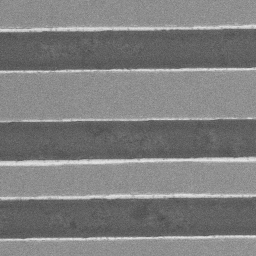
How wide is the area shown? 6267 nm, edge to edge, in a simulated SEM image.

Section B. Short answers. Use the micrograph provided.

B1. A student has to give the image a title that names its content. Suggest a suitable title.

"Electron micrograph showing lines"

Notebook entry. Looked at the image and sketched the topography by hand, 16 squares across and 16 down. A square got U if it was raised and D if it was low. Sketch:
UUUUUUUUUUUUUUUU
UUUUUUUUUUUUUUUU
DDDDDDDDDDDDDDDD
DDDDDDDDDDDDDDDD
UUUUUUUUUUUUUUUU
UUUUUUUUUUUUUUUU
UUUUUUUUUUUUUUUU
UUUUUUUUDDDDDDDD
DDDDDDDDDDDDDDDD
DDDDDDDDDDDDDDDD
UUUUUUUUUUUUUUUU
UUUUUUUUUUUUUUUU
DDDDDDDDDDDDDDDD
DDDDDDDDDDDDDDDD
DDDDDDDDDDDDDDDD
UUUUUUUUUUUUUUUU